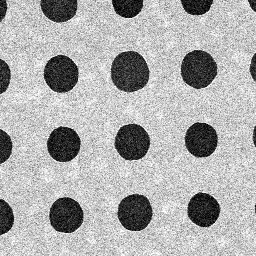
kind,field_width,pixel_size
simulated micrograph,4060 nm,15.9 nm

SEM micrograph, a regular array of holes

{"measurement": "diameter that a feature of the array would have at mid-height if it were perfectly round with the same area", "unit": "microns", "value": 0.571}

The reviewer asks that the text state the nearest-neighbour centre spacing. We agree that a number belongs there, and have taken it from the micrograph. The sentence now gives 1090 nm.